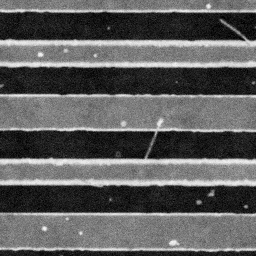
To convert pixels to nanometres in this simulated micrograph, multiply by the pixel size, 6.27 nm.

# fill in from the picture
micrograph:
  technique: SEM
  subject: lines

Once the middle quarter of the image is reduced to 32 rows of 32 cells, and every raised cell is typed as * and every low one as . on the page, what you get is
....****.......*.*.......****.**
................................
................................
................................
................................
................................
................................
................................
********************************
********************************
********************************
********************************
********************************
********************************
********************************
********************************
***..***************************
................................
................................
................................
................................
................................
................................
................................
********************************
********************************
********************************
********************************
********************************
********************************
........**......................
................................